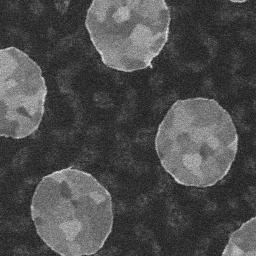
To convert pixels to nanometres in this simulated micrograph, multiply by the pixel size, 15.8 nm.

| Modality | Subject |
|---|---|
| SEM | raised bodies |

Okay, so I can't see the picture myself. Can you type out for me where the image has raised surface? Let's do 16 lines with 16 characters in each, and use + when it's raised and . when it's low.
......++++......
.....++++++.....
......++++......
++....++++......
+++.............
+++.............
+++........+++..
+++.......++++..
++........+++++.
..........+++++.
..........++++..
..++++.....++...
..+++++.........
..+++++.........
..+++++........+
...+++........++